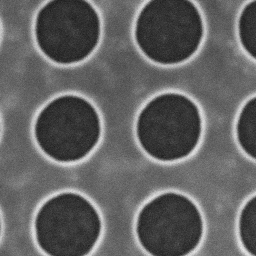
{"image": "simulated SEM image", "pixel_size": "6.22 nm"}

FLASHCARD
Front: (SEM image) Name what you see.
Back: holes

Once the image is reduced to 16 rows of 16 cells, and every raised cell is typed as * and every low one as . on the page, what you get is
***...***...***.
**....***....**.
**....***....**.
***..****...****
****************
****************
***...***...***.
**....***....**.
**....***....**.
***...***...***.
****************
****************
***..****...****
**....***....**.
**....***....**.
***...***...***.